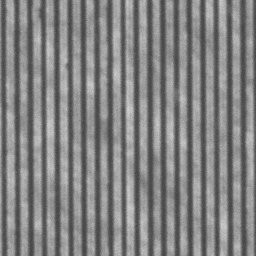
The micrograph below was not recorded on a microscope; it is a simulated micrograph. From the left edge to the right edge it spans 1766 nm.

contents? parallel lines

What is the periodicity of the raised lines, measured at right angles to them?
91.7 nanometers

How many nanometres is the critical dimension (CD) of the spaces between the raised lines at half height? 54.3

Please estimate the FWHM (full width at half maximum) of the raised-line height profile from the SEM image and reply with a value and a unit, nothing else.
0.0345 microns